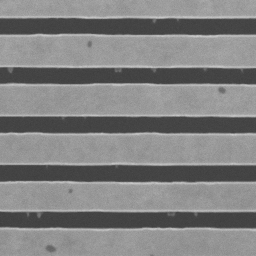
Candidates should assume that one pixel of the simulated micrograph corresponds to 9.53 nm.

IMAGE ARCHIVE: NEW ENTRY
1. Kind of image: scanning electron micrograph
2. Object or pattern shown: lines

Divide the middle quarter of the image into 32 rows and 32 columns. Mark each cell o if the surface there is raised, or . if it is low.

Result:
oooooooooooooooooooooooooooooooo
................................
................................
................................
................................
oooooooooooooooooooooooooooooooo
oooooooooooooooooooooooooooooooo
oooooooooooooooooooooooooooooooo
oooooooooooooooooooooooooooooooo
oooooooooooooooooooooooooooooooo
oooooooooooooooooooooooooooooooo
oooooooooooooooooooooooooooooooo
oooooooooooooooooooooooooooooooo
................................
................................
................................
................................
..o..oooooo..oooooooooooo...oo.o
oooooooooooooooooooooooooooooooo
oooooooooooooooooooooooooooooooo
oooooooooooooooooooooooooooooooo
oooooooooooooooooooooooooooooooo
oooooooooooooooooooooooooooooooo
oooooooooooooooooooooooooooooooo
oooooooooooooooooooooooooooooooo
................................
................................
................................
................................
oooo............................
oooooooooooooooooooooooooooooooo
oooooooooooooooooooooooooooooooo